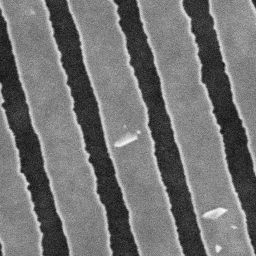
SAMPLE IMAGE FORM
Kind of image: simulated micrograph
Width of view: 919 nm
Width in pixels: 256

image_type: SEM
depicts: lines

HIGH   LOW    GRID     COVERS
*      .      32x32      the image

******..******...******...******
******...******..******...******
.*****...******...******...*****
.******...*****...******...*****
.******...******..******...*****
.******...******...******..*****
..*****...******...******...****
..******..******...******...****
..******...******...*****...****
..******...******...*****...****
...*****...******...******...***
...******...******..******...***
...******...******..******...***
....*****...******...******...**
*...*****...*******..******...**
*...******...******..******...**
*...******...******...******...*
**...*****...******...******...*
**...******..******...******...*
**...******...*****....*****...*
***...*****...******...*****....
***...******..******...******...
***...******...*****...******...
***...******...******...*****...
****...*****...******...******..
****...******...*****...******..
****...******...*****...******..
*****...*****...******...******.
*****...******..******...******.
*****...******...*****...******.
*****...******...******..******.
*****....*****...******...******